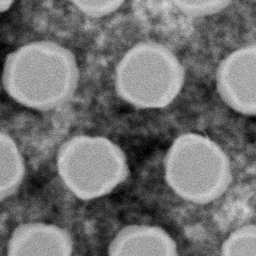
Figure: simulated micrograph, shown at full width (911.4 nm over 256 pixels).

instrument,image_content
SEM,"raised bodies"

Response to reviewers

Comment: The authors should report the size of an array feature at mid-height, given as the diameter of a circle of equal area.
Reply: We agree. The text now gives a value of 226 nanometers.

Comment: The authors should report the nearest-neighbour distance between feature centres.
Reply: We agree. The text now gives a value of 0.367 um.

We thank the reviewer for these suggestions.